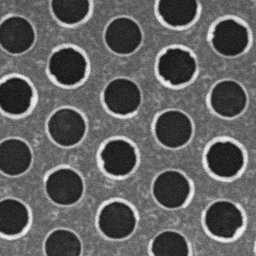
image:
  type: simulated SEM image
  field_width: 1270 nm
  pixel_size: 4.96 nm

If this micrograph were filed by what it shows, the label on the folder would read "a regular array of holes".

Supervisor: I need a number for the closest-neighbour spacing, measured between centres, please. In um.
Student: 0.297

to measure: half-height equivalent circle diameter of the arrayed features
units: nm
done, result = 188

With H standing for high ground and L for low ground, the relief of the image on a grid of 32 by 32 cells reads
HHHHHHLLLLLHHHHHHHHHLLLLLHHHHHHH
HHHHHHHLLLLHHHHHHHHHLLLLLHHHHHHH
HLLHHHHLLLHHHHLLLHHHLLLLHHHHLHHH
LLLLHHHHHHHHHLLLLHHHHHHHHHHLLLLH
LLLLHHHHHHHHHLLLLLHHHHHHHHHLLLLH
LLLLHHHHHHHHHLLLLLHHHHHHHHLLLLLH
HLLHHHHLLLHHHHLLLHHHHLLHHHHLLLHH
HHHHHHLLLLLHHHHHHHHHLLLLHHHHHHHH
HHHHHHLLLLLHHHHHHHHHLLLLLHHHHHHH
HHHHHHHLLLLHHHHHHHHHLLLLHHHHHHHH
LLLLHHHHLHHHHHLLLHHHHHLHHHHLLLHH
LLLLHHHHHHHHHLLLLLHHHHHHHHLLLLLH
LLLLHHHHHHHHHLLLLLHHHHHHHHLLLLLH
LLLLHHHHLHHHHHLLLHHHHHHHHHLLLLLH
HHHHHHLLLLHHHHHHHHHHLLLHHHHHLLHH
HHHHHHLLLLLHHHHHHHHLLLLLHHHHHHHH
HHHHHHLLLLLHHHHHHHHLLLLLHHHHHHHH
HLLHHHHLLLHHHHLLHHHHLLLLHHHHHHHH
LLLLHHHHHHHHHLLLLHHHHLHHHHLLLLHH
LLLLHHHHHHHHHLLLLHHHHHHHHHLLLLHH
LLLLHHHHHHHHHLLLLHHHHHHHHHLLLLHH
LLLHHHHLLLHHHLLLHHHHLLLHHHHLLLHH
HHHHHHLLLLHHHHHHHHHLLLLHHHHHHHHH
HHHHHHLLLLLHHHHHHHHLLLLLHHHHHHHH
HHHHHHLLLLHHHHHHHHHLLLLLHHHHHHHH
LLLHHHHLLHHHHHLLHHHHLLLHHHLLLHHH
LLLLHHHHHHHHHLLLLHHHHHHHHHLLLLHH
LLLLHHHHHHHHLLLLLHHHHHHHHHLLLLHH
LLLHHHHHHHHHLLLLLHHHHHHHHHLLLLHH
HLHHHHLLLLHHHLLLHHHHLLLHHHHLLHHH
HHHHHHLLLLHHHHHHHHHLLLLHHHHHHHHH
HHHHHHLLLLHHHHHHHHHLLLLLHHHHHHHH